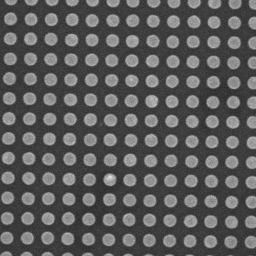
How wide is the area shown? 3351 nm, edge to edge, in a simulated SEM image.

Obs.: a regular array of raised bodies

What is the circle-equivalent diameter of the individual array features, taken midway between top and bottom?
159 nm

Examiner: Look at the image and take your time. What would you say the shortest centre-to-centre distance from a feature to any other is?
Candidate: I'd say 258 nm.